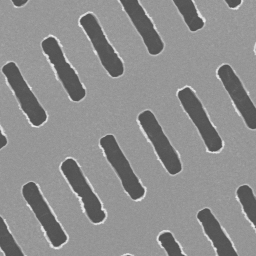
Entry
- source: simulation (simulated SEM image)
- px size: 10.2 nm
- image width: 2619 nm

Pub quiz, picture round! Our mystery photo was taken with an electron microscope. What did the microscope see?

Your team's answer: a regular array of holes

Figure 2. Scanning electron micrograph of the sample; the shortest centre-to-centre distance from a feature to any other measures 465 nm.